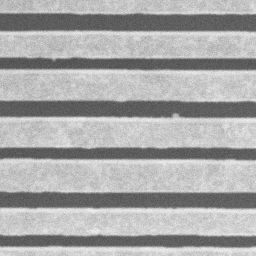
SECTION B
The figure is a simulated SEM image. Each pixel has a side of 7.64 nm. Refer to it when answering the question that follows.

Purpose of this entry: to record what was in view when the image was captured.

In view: lines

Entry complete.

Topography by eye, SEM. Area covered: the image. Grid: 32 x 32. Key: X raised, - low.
XXXXXXXXXXXXXXXXXXXXXXXXXXXXXXXX
XXXXXXXXXXXXXXXXXXXXXXXXXXXXXXXX
--------------------------------
--------------------------------
XXXXXXXXXXXXXXXXXXXXXXXXXXXXXXXX
XXXXXXXXXXXXXXXXXXXXXXXXXXXXXXXX
XXXXXXXXXXXXXXXXXXXXXXXXXXXXXXXX
--------------------------------
--------------------------------
XXXXXXXXXXXXXXXXXXXXXXXXXXXXXXXX
XXXXXXXXXXXXXXXXXXXXXXXXXXXXXXXX
XXXXXXXXXXXXXXXXXXXXXXXXXXXXXXXX
--------------XX-------XXXXXX---
--------------------------------
--------------------------------
XXXXXXXXXXXXXXXXXXXXXXXXXXXXXXXX
XXXXXXXXXXXXXXXXXXXXXXXXXXXXXXXX
XXXXXXXXXXXXXXXXXXXXXXXXXXXXXXXX
--------------------------------
--------------------------------
XXXXXXXXXXXXXXXXXXXXXXXXXXXXXXXX
XXXXXXXXXXXXXXXXXXXXXXXXXXXXXXXX
XXXXXXXXXXXXXXXXXXXXXXXXXXXXXXXX
XXXXXXXXXXXXXXXXXXXXXXXXXXXXXXXX
--------------------------------
--------------------------------
XXXXXXXXXXXXXXXXXXXXXXXXXXXXXXXX
XXXXXXXXXXXXXXXXXXXXXXXXXXXXXXXX
XXXXXXXXXXXXXXXXXXXXXXXXXXXXXXXX
--------------------------------
--------------------------------
XXXXXXXXXXXXXXXXXXXXXXXXXXXXXXXX